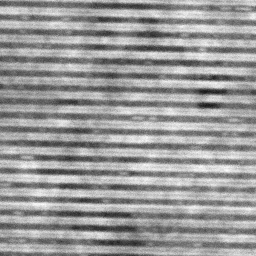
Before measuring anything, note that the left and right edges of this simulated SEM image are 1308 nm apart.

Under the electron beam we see parallel lines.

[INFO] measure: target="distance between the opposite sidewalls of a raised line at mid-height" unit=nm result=30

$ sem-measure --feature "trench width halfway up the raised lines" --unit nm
39.6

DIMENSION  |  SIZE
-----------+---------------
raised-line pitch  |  71.2 nm